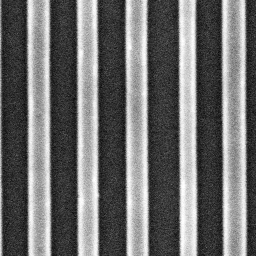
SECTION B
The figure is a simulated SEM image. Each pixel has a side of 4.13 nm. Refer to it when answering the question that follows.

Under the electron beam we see parallel lines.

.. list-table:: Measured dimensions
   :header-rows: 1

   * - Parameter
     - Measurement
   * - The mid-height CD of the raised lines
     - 77.9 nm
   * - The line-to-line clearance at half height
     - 123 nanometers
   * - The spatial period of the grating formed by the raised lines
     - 0.202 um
